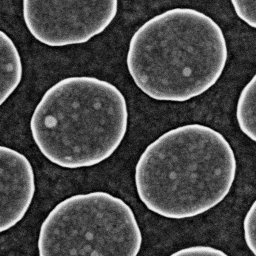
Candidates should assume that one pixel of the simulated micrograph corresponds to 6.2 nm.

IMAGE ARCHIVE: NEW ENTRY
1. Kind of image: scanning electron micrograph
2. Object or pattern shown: raised bodies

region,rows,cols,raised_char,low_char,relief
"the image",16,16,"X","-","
--XXXXX--------X
--XXXXX--XXXX---
X--XX---XXXXXX--
X-------XXXXXX--
X-------XXXXXX--
X--XXXX--XXXX--X
--XXXXXX-------X
--XXXXXX-------X
--XXXXXX--XXXX--
X--XXXX--XXXXX--
XX-------XXXXXX-
XX-------XXXXX--
XX--XXX--XXXXX--
X--XXXXX---X----
---XXXXXX------X
---XXXXXX-------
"